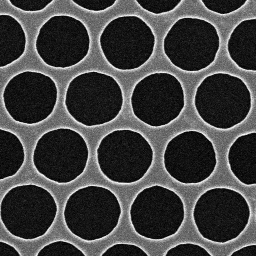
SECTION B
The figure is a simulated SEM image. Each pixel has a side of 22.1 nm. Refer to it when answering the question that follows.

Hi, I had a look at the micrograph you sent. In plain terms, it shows a regular array of holes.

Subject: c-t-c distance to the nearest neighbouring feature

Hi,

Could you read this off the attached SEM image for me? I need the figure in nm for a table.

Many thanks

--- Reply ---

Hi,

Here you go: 1420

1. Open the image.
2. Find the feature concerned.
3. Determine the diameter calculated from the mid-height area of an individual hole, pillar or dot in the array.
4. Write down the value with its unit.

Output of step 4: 1200 nm